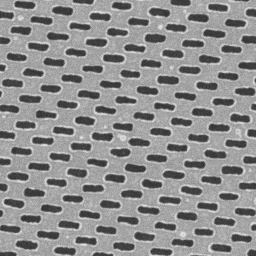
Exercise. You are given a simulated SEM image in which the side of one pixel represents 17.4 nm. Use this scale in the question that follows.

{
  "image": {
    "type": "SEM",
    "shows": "a regular array of holes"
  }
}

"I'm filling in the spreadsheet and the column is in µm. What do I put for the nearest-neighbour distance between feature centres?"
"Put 0.394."